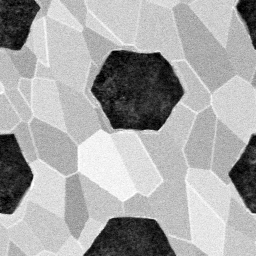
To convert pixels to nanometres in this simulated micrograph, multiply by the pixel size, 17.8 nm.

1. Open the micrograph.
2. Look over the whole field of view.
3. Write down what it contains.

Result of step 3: holes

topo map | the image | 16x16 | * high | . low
..*************.
..*************.
..**************
*******...******
******.....*****
******.....*****
******.....*****
*******...******
.***************
.**************.
..*************.
..*************.
.**************.
****************
******....******
******.....*****